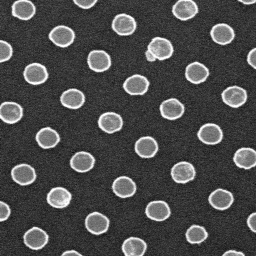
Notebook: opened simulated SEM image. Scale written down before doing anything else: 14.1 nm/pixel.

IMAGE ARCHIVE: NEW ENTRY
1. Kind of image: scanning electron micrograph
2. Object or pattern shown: a regular array of raised bodies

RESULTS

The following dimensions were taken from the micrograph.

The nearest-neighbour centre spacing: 612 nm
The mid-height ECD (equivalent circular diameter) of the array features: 292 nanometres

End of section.